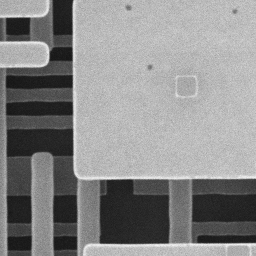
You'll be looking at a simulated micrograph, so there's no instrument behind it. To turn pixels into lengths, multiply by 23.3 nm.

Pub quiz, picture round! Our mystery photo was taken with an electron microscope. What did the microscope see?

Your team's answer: wiring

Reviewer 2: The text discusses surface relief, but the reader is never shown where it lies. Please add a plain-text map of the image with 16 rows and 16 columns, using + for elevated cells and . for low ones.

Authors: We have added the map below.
+++..+++++++++++
.....+++++++++++
.....+++++++++++
+++..+++++++++++
.....+++++++++++
.....+++++++++++
.....+++++++++++
.....+++++++++++
.....+++++++++++
.....+++++++++++
.....+++++++++++
................
................
................
................
.....+++++++++++